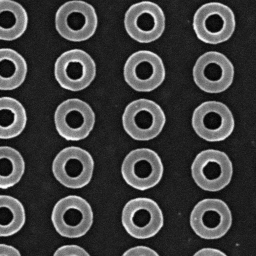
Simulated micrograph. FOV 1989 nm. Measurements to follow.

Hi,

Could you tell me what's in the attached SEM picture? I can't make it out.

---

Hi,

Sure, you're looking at a regular array of ring-shaped raised bodies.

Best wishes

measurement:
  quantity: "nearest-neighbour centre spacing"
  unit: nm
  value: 380